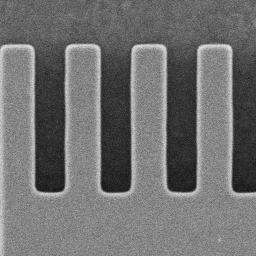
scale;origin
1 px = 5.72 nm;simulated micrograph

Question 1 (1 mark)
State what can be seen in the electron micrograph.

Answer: groups of lines, slits or small figures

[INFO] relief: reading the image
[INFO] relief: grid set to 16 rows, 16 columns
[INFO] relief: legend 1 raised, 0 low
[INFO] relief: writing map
0000000000000000
0000000000000000
0000000000000000
1100110011001100
1100110011001100
1100110011001100
1100110011001100
1100110011001110
1100110011001110
1100110011001100
1100110011001100
1100110011001100
1111111111111111
1111111111111111
1111111111111111
1111111111111111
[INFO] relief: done